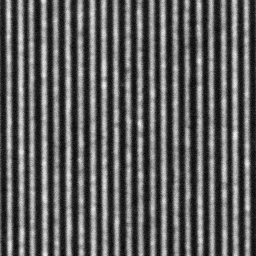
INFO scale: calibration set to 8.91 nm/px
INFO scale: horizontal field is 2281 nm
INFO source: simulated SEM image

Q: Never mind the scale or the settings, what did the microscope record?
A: parallel lines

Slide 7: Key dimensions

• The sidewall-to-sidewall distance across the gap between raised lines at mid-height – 0.0735 µm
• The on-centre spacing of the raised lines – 106 nm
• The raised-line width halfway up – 0.0323 um